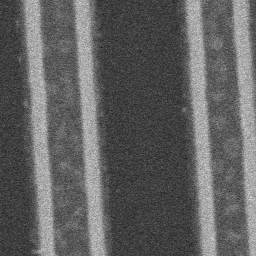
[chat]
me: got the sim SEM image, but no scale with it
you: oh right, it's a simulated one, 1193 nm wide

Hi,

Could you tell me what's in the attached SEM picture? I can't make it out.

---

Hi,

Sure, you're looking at one or a few lines or trenches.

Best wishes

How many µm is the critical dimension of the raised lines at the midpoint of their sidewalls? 0.226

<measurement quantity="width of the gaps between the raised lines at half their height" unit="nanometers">520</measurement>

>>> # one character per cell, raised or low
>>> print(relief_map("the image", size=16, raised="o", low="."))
..ooo.......ooo.
..ooo.......ooo.
..ooo.......ooo.
..ooo.......ooo.
..ooo.......ooo.
..ooo.......ooo.
..oooo......ooo.
..oooo.......ooo
...ooo.......ooo
...ooo.......ooo
...ooo.......ooo
...ooo.......ooo
...ooo.......ooo
...ooo.......ooo
...ooo.......ooo
...ooo.......ooo